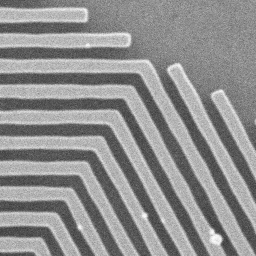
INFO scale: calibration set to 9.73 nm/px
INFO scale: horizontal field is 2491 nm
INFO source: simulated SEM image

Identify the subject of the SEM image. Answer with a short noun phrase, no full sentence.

groups of lines, slits or small figures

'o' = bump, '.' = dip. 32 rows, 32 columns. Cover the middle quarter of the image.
oooooooooooooooooooooo.....oo...
ooooooooooooooooooooooo...oooo..
...................oooo...oooo..
....................ooo....oooo.
....................oooo....ooo.
ooooo...ooooooooo....ooo....oooo
oooooooooooooooooo...oooo....ooo
oooooooooooooooooo....ooo....ooo
ooo......ooo..ooooo....ooo....oo
................ooo....oooo...oo
................oooo....ooo....o
.................oooo...oooo....
oooooooooooooo...oooo....ooo....
oooooooooooooo....oooo...oooo...
o.ooooooooooooo....ooo....oooo..
............oooo...oooo...oooo..
............oooo....ooo....oooo.
.............oooo...oooo....ooo.
oooooooooo....ooo....ooo....oooo
oooooooooo....oooo...oooo....ooo
ooooooooooo....ooo....ooo....ooo
.......oooo....oooo....ooo....oo
........oooo....ooo....ooo....oo
.........ooo....oooo...oooo....o
.........oooo....ooo....ooo....o
oooooo....oooo....ooo...oooo....
ooooooo...oooo....ooo....ooo....
....ooo....oooo....ooo....ooo...
.....ooo....ooo....oooo...oooo..
.....ooo....oooo....ooo....ooo..
.....oooo....ooo....ooo....oooo.
oo....ooo.....ooo....ooo....ooo.